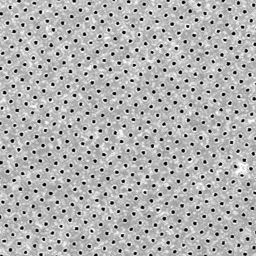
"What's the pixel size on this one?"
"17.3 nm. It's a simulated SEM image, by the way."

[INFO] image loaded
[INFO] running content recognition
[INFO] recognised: a regular array of holes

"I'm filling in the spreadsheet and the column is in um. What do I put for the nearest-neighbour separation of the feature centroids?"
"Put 0.184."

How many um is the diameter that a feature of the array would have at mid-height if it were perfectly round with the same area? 0.0676